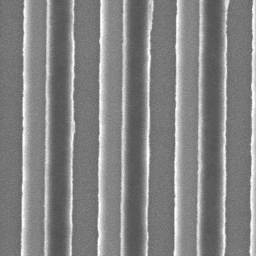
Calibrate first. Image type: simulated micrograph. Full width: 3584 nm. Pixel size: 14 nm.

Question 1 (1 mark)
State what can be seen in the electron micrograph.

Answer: lines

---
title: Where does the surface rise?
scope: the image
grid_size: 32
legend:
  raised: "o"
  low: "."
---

...oooooo....oooooo...ooooooo...
...oooooo....oooooo...oooooo....
...oooooo....oooooo...oooooo....
...oooooo....oooooo...oooooo....
...oooooo....oooooo...oooooo....
...oooooo....oooooo...oooooo....
...oooooo....oooooo...oooooo....
...oooooo....oooooo...oooooo....
...oooooo....oooooo...oooooo....
...oooooo....oooooo...oooooo....
...oooooo....oooooo...oooooo...o
...oooooo....oooooo...oooooo....
...oooooo....ooooo....oooooo....
...oooooo....ooooo....oooooo....
...oooooo....ooooo....oooooo....
...oooooo....ooooo....oooooo....
...oooooo....ooooo....oooooo....
...oooooo....ooooo....oooooo...o
...oooooo....ooooo....oooooo...o
...oooooo...oooooo....oooooo...o
...oooooo...oooooo....oooooo...o
...oooooo...oooooo....oooooo...o
...oooooo...oooooo....oooooo...o
...oooooo...oooooo....oooooo...o
...oooooo...oooooo....oooooo...o
...oooooo...oooooo....oooooo...o
...oooooo...oooooo....oooooo...o
...oooooo...oooooo....oooooo...o
...oooooo...oooooo....oooooo...o
...oooooo...oooooo....oooooo...o
...oooooo...oooooo....oooooo...o
...oooooo...oooooo....oooooo...o